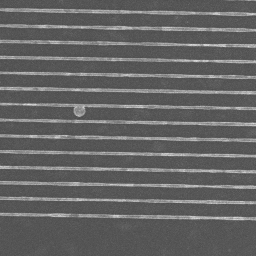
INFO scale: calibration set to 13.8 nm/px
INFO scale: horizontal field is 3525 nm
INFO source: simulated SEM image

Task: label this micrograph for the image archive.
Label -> parallel lines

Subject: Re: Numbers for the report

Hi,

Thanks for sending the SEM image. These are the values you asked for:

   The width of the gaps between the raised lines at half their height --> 188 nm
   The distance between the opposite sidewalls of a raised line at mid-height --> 31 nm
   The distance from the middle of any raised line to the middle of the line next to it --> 0.217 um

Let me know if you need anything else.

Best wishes